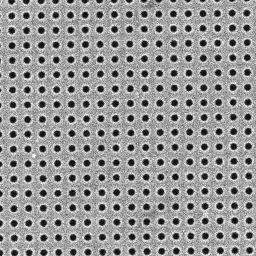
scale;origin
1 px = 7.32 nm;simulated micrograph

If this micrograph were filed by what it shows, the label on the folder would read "a regular array of holes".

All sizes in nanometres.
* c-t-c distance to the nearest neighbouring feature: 106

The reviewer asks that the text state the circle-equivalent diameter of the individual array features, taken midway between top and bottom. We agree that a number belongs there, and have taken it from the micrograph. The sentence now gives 54.1 nanometers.